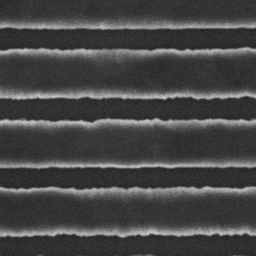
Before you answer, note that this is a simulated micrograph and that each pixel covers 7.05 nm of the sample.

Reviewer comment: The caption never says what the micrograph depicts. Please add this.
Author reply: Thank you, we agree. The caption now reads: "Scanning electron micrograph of lines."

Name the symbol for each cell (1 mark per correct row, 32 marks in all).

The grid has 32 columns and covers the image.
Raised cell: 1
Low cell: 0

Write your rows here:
11111111111111111111111111111111
11111111111111111111111111111111
11111111111111111111111111111111
00000000000000000000000000000000
00000000000000000000000000000000
00000000000000000000000000000000
11111111111100000101111111111111
11111111111111111111111111111111
11111111111111111111111111111111
11111111111111111111111111111111
11111111111111111111111111111111
11111111111111111111111111111111
00000000000000000000000000000000
00000000000000000000000000000000
00000000000000000000000000000000
11111111111111111111111111111111
11111111111111111111111111111111
11111111111111111111111111111111
11111111111111111111111111111111
11111111111111111111111111111111
11111111111111111111111111111111
00000000000000000000000000000000
00000000000000000000000000000000
00000000000000000000000000000000
11111111111111111111111111111111
11111111111111111111111111111111
11111111111111111111111111111111
11111111111111111111111111111111
11111111111111111111111111111111
00000000000000000000000000000000
00000000000000000000000000000000
00000000000000000000000000000000